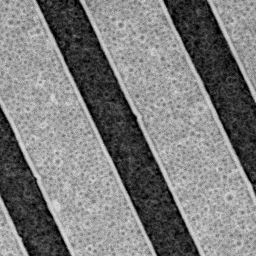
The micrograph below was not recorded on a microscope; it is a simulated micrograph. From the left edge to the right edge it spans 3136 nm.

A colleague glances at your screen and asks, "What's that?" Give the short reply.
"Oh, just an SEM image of one or a few lines or trenches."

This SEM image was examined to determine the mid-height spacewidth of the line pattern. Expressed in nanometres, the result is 539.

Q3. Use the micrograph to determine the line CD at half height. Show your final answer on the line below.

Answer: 881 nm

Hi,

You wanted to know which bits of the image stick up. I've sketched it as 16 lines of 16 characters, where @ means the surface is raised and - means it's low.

@@---@@@@@---@@@
@@@---@@@@@---@@
@@@---@@@@@---@@
@@@@---@@@@@---@
@@@@---@@@@@---@
@@@@@---@@@@@---
@@@@@---@@@@@---
-@@@@@---@@@@@--
-@@@@@---@@@@@--
--@@@@@---@@@@@-
--@@@@@---@@@@@-
---@@@@@---@@@@@
---@@@@@---@@@@@
---@@@@@----@@@@
@---@@@@@---@@@@
@---@@@@@---@@@@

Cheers